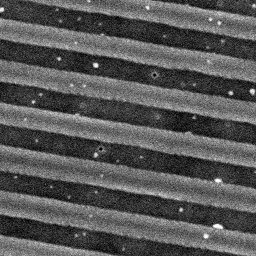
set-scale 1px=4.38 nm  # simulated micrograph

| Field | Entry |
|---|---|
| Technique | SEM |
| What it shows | lines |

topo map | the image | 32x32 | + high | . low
.......++++++++++++++...........
.............++++++++++++++.....
...................+++++++++++++
++++++...................+++++++
+++++++++++...................++
.....++++++++++++...............
...........+++++++++++++........
.................++++++++++++...
++++....................++++++++
++++++++++..................++++
....++++++++++++................
..........++++++++++++..........
................++++++++++++....
++...................+++++++++++
+++++++++..................+++++
..+++++++++++++.................
........++++++++++++............
.............++++++++++++++.....
+...................++++++++++++
++++++...................+++++++
++++++++++++..................++
...+++++++++++++++..............
..........++++++++++++++........
..............++++++++++++++++..
++..................++++++++++++
++++++++...................+++++
+++++++++++++...................
.....++++++++++++++.............
............+++++++++++++.......
..................++++++++++++++
+++++..................+++++++++
+++++++++++..................+++